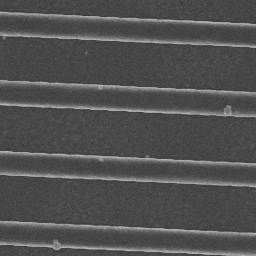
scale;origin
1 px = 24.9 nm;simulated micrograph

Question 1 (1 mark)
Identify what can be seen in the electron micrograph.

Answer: lines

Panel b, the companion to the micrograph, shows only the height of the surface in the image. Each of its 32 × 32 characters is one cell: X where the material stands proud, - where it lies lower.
--------------------------------
--------------------------------
XXXXXXXXXXXXXXXXXX--------------
XXXXXXXXXXXXXXXXXXXXXXXXXXXXXXXX
----XXXXXXXXXXXXXXXXXXXXXXXXXXXX
--------------------------XXXXXX
--------------------------------
--------------------------------
--------------------------------
--------------------------------
XXXXXXX-------------------------
XXXXXXXXXXXXXXXXXXXXXXXXXXXX----
XXXXXXXXXXXXXXXXXXXXXXXXXXXXXXXX
----------XXXXXXXXXXXXXXXXXXXXXX
--------------------------------
--------------------------------
--------------------------------
--------------------------------
--------------------------------
XXXXXXXXXX----------------------
XXXXXXXXXXXXXXXXXXXXXXXXXXXXXXXX
XXXXXXXXXXXXXXXXXXXXXXXXXXXXXXXX
----------------XXXXXXXXXXXXXXXX
--------------------------------
--------------------------------
--------------------------------
--------------------------------
--------------------------------
XXXXXXXXXXXXXXXXX---------------
XXXXXXXXXXXXXXXXXXXXXXXXXXXXXXXX
XXXXXXXXXXXXXXXXXXXXXXXXXXXXXXXX
----------------------XXXXXXXXXX